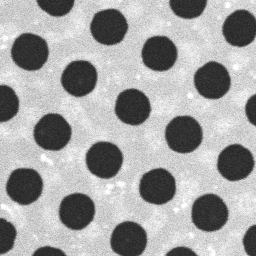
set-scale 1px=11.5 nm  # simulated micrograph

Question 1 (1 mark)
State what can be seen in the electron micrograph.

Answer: a regular array of holes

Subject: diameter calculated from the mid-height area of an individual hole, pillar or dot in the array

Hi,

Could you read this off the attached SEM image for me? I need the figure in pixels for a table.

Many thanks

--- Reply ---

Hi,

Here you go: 37.5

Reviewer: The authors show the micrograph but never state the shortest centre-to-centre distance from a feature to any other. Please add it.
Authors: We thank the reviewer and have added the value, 667 nanometres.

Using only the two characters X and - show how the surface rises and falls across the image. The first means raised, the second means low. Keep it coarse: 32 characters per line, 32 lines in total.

XXXXX----XXXXXXXXXXXX-----XXXXXX
XXXXXX---XXX---XXXXXXX---XXXX--X
XXXXXXXXXXX-----XXXXXXXXXXXX----
XXXXXXXXXXX-----XXXXXXXXXXXX----
XX---XXXXXXX----XXX-XXXXXXXX----
XX----XXXXXXX--XXX----XXXXXXX--X
X-----XXXXXXXXXXXX----XXXXXXXXXX
XX----XXXXXXXXXXXX----XXXXXXXXXX
XXX--XXX----XXXXXXX--XXXX---XXXX
XXXXXXXX----XXXXXXXXXXXX-----XXX
XXXXXXXX----XXXXXXXXXXXX-----XXX
--XXXXXX---XXXX---XXXXXXX---XXXX
--XXXXXXXXXXXXX----XXXXXXXXXXXX-
--XXXXXXXXXXXX-----XXXXXXXXXXXX-
--XXX---XXXXXXX----XXX--XXXXXXX-
XXXX-----XXXXXXX--XXX----XXXXXX-
XXXX-----XXXXXXXXXXXX----XXXXXXX
XXXX-----XXXXXXXXXXXX----XXXXXXX
XXXXX---XXX----XXXXXX----XXX---X
XXXXXXXXXXX----XXXXXXXXXXXX-----
XXXXXXXXXXX----XXXXXXXXXXXX-----
XX---XXXXXX----XXX---XXXXXX----X
X----XXXXXXXXXXXXX----XXXXXX--XX
X----XXXXXXXXXXXX-----XXXXXXXXXX
X----XXX---XXXXXXX----XXX--XXXXX
XX--XXXX----XXXXXXX-XXXX----XXXX
XXXXXXX-----XXXXXXXXXXXX-----XXX
-XXXXXXX----XXXXXXXXXXXX----XXXX
--XXXXXXX--XXX----XXXXXXX---XXX-
--XXXXXXXXXXXX----XXXXXXXXXXXX--
--XXXXXXXXXXXX----XXXXXXXXXXXX--
-XXX----XXXXXX----XXX---XXXXXXX-